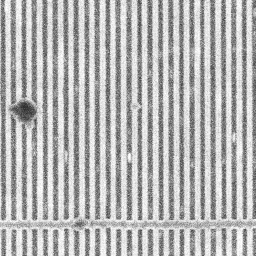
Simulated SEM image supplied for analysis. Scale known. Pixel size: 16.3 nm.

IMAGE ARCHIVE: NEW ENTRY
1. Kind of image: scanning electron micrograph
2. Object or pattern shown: parallel lines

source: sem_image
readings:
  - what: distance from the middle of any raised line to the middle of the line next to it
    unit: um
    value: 0.171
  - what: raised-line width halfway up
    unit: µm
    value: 0.0733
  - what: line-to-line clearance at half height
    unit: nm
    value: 104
